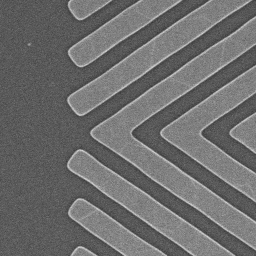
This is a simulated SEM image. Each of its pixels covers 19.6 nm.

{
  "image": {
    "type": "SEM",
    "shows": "groups of lines, slits or small figures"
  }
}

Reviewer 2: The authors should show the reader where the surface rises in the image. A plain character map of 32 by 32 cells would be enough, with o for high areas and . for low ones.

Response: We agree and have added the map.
.........oooo....ooooo....ooooo.
.........ooo...oooooo...ooooo...
..............ooooo....ooooo...o
............oooooo...ooooo....oo
...........ooooo....ooooo....ooo
..........ooooo...ooooo....ooooo
.........oooo....ooooo...oooooo.
.........ooo...ooooo....ooooo...
..............ooooo....ooooo...o
.............ooooo...ooooo....oo
...........ooooo....ooooo....ooo
.........oooooo...ooooo....ooooo
.........oooo....ooooo....ooooo.
.........ooo...ooooo....ooooo...
..............ooooo....ooooo...o
............oooooo...ooooo....oo
...........oooooo...ooooo....ooo
............ooooo....ooooo....oo
..............ooooo...ooooo....o
.........oo....ooooo....ooooo...
.........oooo....oooo....ooooo..
.........ooooo....ooooo....ooooo
...........ooooo...ooooo....oooo
............ooooo....ooooo...ooo
..............ooooo...ooooo....o
.........oo....ooooo....ooooo...
.........oooo...ooooo....ooooo..
.........ooooo....ooooo....ooooo
...........ooooo...ooooo....oooo
............ooooo....ooooo...ooo
.............oooooo...ooooo....o
.........oo....ooooo....ooooo...